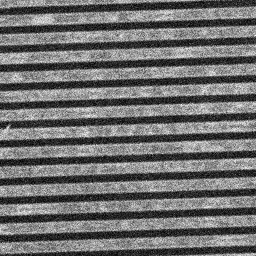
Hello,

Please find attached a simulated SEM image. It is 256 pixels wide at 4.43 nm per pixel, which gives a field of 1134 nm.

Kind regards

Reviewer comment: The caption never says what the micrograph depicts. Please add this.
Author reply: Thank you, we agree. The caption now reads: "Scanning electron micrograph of parallel lines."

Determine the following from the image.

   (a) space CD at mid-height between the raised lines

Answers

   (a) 39.8 nm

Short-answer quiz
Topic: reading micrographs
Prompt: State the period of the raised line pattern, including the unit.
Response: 0.0838 microns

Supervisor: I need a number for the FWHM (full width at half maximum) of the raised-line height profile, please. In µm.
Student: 0.0442